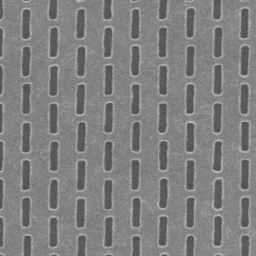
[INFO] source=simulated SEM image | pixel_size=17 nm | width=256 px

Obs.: a regular array of holes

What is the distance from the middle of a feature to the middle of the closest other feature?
557 nm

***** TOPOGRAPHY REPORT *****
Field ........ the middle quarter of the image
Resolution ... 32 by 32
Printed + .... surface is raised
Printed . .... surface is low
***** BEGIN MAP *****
+++..+++++..+++++..+++++.+++++..
+++..+++++..+++++..+++++..++++..
+++..+++++..+++++..+++++..++++..
++++++++++..++++++++++++..++++++
++++++++++..++++++++++++..++++++
+++..+++++..+++++..+++++..+++++.
+++..+++++..+++++..+++++..+++++.
+++..+++++..+++++..+++++..++++..
+++..++++++++++++..+++++++++++..
+++..++++++++++++..+++++++++++..
+++..+++++..+++++..+++++..++++..
+++..+++++..+++++..+++++..+++++.
++++.+++++..+++++.++++++..+++++.
++++++++++..++++++++++++..++++++
++++.+++++..+++++++++++...++++++
+++..+++++..+++++..++++...+++++.
+++..+++++..+++++..++++..++++++.
+++..++++++++++++..+++++++++++..
+++..++++++++++++..+++++++++++..
+++..+++++..+++++..+++++..++++..
+++..+++++..+++++..+++++..++++..
+++..+++++..+++++..+++++..+++++.
++++++++++..++++++++++++..++++++
++++++++++..++++++++++++..++++++
+++..+++++..+++++..+++++..+++++.
+++..+++++..+++++..+++++..++++..
+++..+++++..+++++..+++++.+++++..
+++..++++++++++++..+++++++++++..
+++..++++++++++++..++++++++++++.
+++..+++++..+++++..+++++..++++..
+++..+++++..+++++..+++++..++++..
+++..+++++..+++++.++++++..+++++.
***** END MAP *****